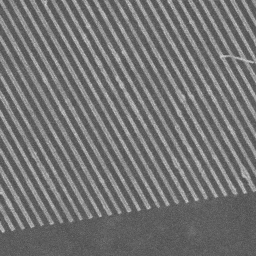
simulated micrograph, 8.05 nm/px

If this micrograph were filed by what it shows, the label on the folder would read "parallel lines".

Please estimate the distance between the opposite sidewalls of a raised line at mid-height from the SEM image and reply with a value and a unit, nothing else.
2.93 pixels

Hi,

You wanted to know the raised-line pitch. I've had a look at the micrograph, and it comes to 9.13 pixels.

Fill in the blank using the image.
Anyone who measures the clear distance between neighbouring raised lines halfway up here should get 5.78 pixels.